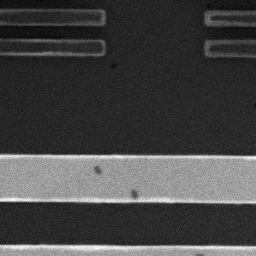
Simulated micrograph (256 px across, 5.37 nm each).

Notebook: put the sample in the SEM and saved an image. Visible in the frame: wiring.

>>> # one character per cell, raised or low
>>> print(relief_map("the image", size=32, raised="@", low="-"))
--------------------------------
@@@@@@@@@@@@@-------------@@@@@@
@@@@@@@@@@@@@-------------@@@@@@
--------------------------------
--------------------------------
@@@@@@@@@@@@@-------------@@@@@@
@@@@--@@@@@@@-------------@@@@@@
--------------------------------
--------------------------------
--------------------------------
--------------------------------
--------------------------------
--------------------------------
--------------------------------
--------------------------------
--------------------------------
--------------------------------
--------------------------------
--------------------------------
@@@@@@@@@@@@@@@-----------------
@@@@@@@@@@@@@@@@@@@@@@@@@@@@@@@@
@@@@@@@@@@@@@@@@@@@@@@@@@@@@@@@@
@@@@@@@@@@@@@@@@@@@@@@@@@@@@@@@@
@@@@@@@@@@@@@@@@@@@@@@@@@@@@@@@@
@@@@@@@@@@@@@@@@@@@@@@@@@@@@@@@@
--------------------------------
--------------------------------
--------------------------------
--------------------------------
--------------------------------
--------------------------------
@@@@@@@@@@@@@@@@@@@@@@@@@@@@@@@@